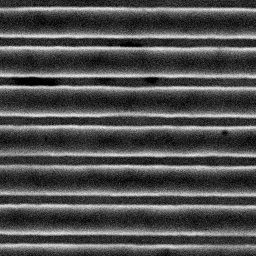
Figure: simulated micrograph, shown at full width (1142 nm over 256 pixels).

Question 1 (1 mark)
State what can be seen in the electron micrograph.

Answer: wiring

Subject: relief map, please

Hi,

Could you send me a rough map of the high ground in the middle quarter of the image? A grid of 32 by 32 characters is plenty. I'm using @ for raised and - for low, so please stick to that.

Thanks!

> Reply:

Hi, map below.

@@@@@@@@@@@@@@@@@@@@@@@@@@@@@@@@
@@@@@@@@@@@@@@@@@@@@@@@@@@@@@@@@
@@@@@@@@@@@@@@@@@@@@@@@@@@@@@@@@
--------------------------------
--------------------------------
--------------------------------
@@@@@@@@@@@@@@@@@@@@@@@@@@@@@@@@
@@@@@@@@@@@@@@@@@@@@@@@@@@@@@@@@
@@@@@@@@@@@@@@@@@@@@@@@@@@@@@@@@
@@@@@@@@@@@@@@@@@@@@@@@@@@@@@@@@
@@@@@@@@@@@@@@@@@@@@@@@@@@@@@@@@
@@@@@@@@@@@@@@@@@@@@@@@@@@@@@@@@
@@@@@@@@@@@@@@@@@@@@@@@@@@@@@@@@
--------------------------------
--------------------------------
--------------------------------
@@@@@@@@@@@@@@@@@@@@@@@@@@@@@@@@
@@@@@@@@@@@@@@@@@@@@@@@@@@@@@@@@
@@@@@@@@@@@@@@@@@@@@@@@@@@@@@@@@
@@@@@@@@@@@@@@@@@@@@@@@@@@@@@@@@
@@@@@@@@@@@@@@@@@@@@@@@@@@@@@@@@
@@@@@@@@@@@@@@@@@@@@@@@@@@@@@@@@
@@@@@@@@@@@@@@@@@@@@@@@@@@@@@@@@
--------------------------------
--------------------------------
------@@@@@@@@@@@@@---@@@@------
@@@@@@@@@@@@@@@@@@@@@@@@@@@@@@@@
@@@@@@@@@@@@@@@@@@@@@@@@@@@@@@@@
@@@@@@@@@@@@@@@@@@@@@@@@@@@@@@@@
@@@@@@@@@@@@@@@@@@@@@@@@@@@@@@@@
@@@@@@@@@@@@@@@@@@@@@@@@@@@@@@@@
@@@@@@@@@@@@@@@@@@@@@@@@@@@@@@@@